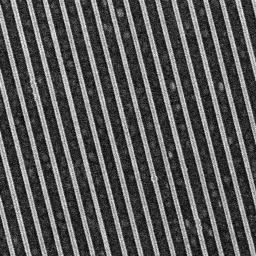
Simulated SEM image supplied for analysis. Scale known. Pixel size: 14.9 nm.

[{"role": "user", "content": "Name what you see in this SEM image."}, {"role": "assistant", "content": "parallel lines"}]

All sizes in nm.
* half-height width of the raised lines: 52.3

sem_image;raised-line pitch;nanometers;232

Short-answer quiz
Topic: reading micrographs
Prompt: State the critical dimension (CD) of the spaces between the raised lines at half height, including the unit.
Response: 171 nanometers